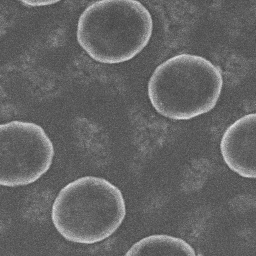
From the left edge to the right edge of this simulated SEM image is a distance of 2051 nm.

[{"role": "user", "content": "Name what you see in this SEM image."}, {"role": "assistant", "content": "raised bodies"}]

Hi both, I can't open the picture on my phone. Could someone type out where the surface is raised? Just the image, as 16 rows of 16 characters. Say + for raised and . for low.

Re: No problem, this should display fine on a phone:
......+++.......
.....++++.......
.....++++.......
......++........
..........++++..
.........+++++..
..........+++...
...............+
+++...........++
+++...........++
+++............+
....+++.........
....++++........
...+++++........
....+++.........
........++++....